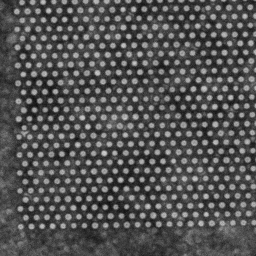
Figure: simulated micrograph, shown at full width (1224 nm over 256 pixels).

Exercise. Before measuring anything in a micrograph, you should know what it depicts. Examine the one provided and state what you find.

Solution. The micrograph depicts a regular array of raised bodies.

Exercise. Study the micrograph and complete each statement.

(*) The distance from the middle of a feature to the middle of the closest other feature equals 48.6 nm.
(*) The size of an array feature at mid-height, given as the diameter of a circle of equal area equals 24.1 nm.